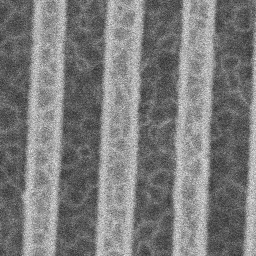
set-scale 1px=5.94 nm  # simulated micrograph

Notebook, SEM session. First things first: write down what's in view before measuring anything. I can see one or a few lines or trenches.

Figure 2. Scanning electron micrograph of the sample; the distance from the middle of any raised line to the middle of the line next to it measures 442 nm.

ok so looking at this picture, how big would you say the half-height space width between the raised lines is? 48.1 px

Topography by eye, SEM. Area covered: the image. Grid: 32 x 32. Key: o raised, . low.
.....ooo......ooo......oooo.....
.....ooo......ooo......ooo......
.....ooo......ooo......ooo......
.....ooo......ooo......ooo......
.....ooo......ooo......ooo......
.....oo.......ooo......ooo......
.....oo.......ooo......ooo......
....ooo.......ooo......ooo......
....ooo.......ooo......ooo......
....ooo......oooo......ooo......
....ooo......oooo......ooo......
....ooo......oooo......ooo......
....ooo......oooo......ooo......
....ooo......oooo......ooo......
....ooo......oooo......ooo......
....ooo......oooo......ooo......
....ooo......oooo......ooo......
....ooo......oooo.....oooo......
....ooo......oooo.....oooo......
....ooo......oooo.....ooo.......
....ooo......oooo......ooo......
....ooo......oooo.....oooo......
....ooo......ooo......ooo.......
....ooo......ooo......ooo.......
...oooo......ooo......ooo......o
...oooo......ooo......ooo......o
....ooo......ooo......ooo......o
....ooo......ooo......ooo......o
....ooo......ooo......ooo......o
....ooo......ooo......ooo......o
....oo.......ooo......ooo......o
...ooo.......ooo......ooo......o